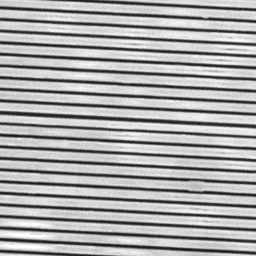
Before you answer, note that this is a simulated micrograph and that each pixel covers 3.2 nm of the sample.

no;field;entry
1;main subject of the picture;parallel lines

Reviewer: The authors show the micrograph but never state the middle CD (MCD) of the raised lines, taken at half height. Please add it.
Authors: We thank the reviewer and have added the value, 8.5 pixels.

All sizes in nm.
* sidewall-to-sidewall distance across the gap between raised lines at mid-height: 12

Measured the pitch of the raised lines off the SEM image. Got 0.0371 micrometres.